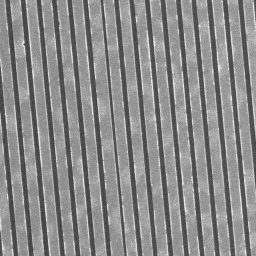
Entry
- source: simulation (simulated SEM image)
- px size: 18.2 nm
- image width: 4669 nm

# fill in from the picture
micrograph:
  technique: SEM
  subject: parallel lines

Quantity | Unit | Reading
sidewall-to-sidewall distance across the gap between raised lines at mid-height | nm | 93.1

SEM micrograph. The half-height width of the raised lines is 0.186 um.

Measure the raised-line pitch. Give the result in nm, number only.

282